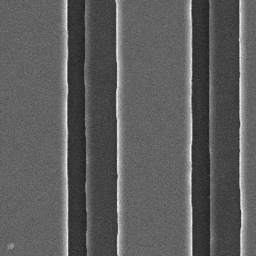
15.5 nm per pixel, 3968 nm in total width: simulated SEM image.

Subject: lines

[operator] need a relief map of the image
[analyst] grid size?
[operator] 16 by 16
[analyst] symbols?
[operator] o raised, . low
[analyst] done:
oooo...ooooo...o
oooo...ooooo...o
oooo...ooooo...o
oooo...ooooo...o
oooo...ooooo...o
oooo...ooooo...o
oooo...ooooo...o
oooo...ooooo...o
oooo...ooooo...o
oooo...ooooo...o
oooo...ooooo...o
oooo...ooooo...o
oooo...ooooo...o
oooo...ooooo...o
oooo...ooooo...o
oooo...ooooo...o